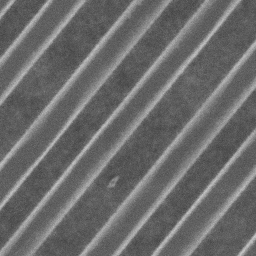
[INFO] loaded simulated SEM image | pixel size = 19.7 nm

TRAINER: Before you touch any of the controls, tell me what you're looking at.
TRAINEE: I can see lines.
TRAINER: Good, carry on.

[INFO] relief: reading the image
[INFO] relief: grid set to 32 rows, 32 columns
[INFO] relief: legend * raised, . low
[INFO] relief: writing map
*.....****.......****.....***...
*....****.......****.....****...
....****.......****.....****....
...*****......****.....****.....
...****......****.....****......
..****.......****.....****......
.****.......****.....****......*
****.......****.....****......**
***.......****.....****......***
***......****.....****.......***
**......****.....****.......****
*.......****.....***.......****.
.......****.....****......****..
......****.....****.......***...
.....****.....****.......****...
....*****....****.......****....
....****....****.......****.....
...****....****.......****.....*
..****.....****......****.....**
.****.....****......****.....***
*****....****.......****.....***
****....****.......****.....****
***....****.......****.....****.
**.....****......****.....****..
*.....****......*****....*****..
.....****.......****....*****...
....****.......****.....****....
...****.......****.....****.....
...***.......****.....****......
..****......*****....****.......
.****......*****....****.......*
****.......****.....****......**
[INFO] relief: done